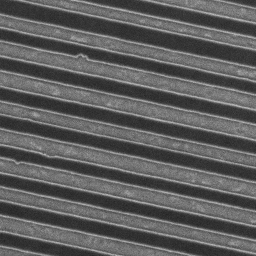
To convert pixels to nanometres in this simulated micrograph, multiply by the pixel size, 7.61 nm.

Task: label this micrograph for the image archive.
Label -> parallel lines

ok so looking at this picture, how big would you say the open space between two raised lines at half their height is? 103 nm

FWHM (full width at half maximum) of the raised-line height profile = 117 nanometers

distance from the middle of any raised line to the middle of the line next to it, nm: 216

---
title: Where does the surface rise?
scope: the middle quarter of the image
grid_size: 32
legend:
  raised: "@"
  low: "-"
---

-------------@@@@@@@@@@@@@@@@@--
@-----------------@@@@@@@@@@@@@@
@@@@@@-----------------@@@@@@@@@
@@@@@@@@@@@----------------@@@@@
@@@@@@@@@@@@@@@-----------------
-@@@@@@@@@@@@@@@@@@@------------
------@@@@@@@@@@@@@@@@@@@-------
-----------@@@@@@@@@@@@@@@@@@---
----------------@@@@@@@@@@@@@@@@
@@@-----------------@@@@@@@@@@@@
@@@@@@@@-----------------@@@@@@@
@@@@@@@@@@@@@-----------------@@
@@@@@@@@@@@@@@@@@@--------------
---@@@@@@@@@@@@@@@@@@-----------
--------@@@@@@@@@@@@@@@@@@------
------------@@@@@@@@@@@@@@@@@@@-
@@@--------------@@@@@@@@@@@@@@@
@@@@@@@@--------------@@@@@@@@@@
@@@@@@@@@@@@@--------------@@@@@
@@@@@@@@@@@@@@@@@@-------------@
----@@@@@@@@@@@@@@@@@@----------
---------@@@@@@@@@@@@@@@@@@-----
--------------@@@@@@@@@@@@@@@@@@
------------------@@@@@@@@@@@@@@
@@@@@@-----------------@@@@@@@@@
@@@@@@@@@@------------------@@@@
@@@@@@@@@@@@@@------------------
---@@@@@@@@@@@@@@@@-------------
--------@@@@@@@@@@@@@@@@@-------
-------------@@@@@@@@@@@@@@@@@--
-----------------@@@@@@@@@@@@@@@
@@@@@-----------------@@@@@@@@@@